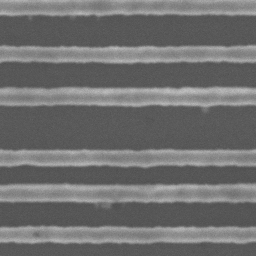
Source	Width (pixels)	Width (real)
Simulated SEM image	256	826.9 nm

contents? lines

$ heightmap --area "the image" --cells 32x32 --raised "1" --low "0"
11111111111111111111111111111111
11111111111111111111111111111111
00000000000000000000000000000000
00000000000000000000000000000000
00000000000000000000000000000000
00000000000000000000000000000000
11111111111111111111111111111111
11111111111111111111111111111111
00000000000000000000000000000000
00000000000000000000000000000000
00000000000000000000000000000000
11111111111111111111111111111111
11111111111111111111111111111111
00000000000000000000000000000000
00000000000000000000000000000000
00000000000000000000000000000000
00000000000000000000000000000000
00000000000000000000000000000000
00000000000000000000000000000000
11111111111111111111111111111111
11111111111111111111111111111111
00000000000000000000000000000000
00000000000000000000000000000000
11111111111111111111111111111111
11111111111111111111111111111111
00000000000000000000000000000000
00000000000000000000000000000000
00000000000000000000000000000000
11111111111011110001111110111101
11111111111111111111111111111111
00000000000000000000000000000000
00000000000000000000000000000000